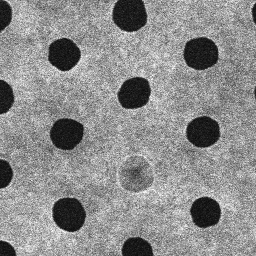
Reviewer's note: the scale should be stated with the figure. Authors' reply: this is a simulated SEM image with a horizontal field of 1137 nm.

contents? holes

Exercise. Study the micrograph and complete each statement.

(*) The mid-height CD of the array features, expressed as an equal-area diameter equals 146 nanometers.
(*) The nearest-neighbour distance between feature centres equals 352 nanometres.